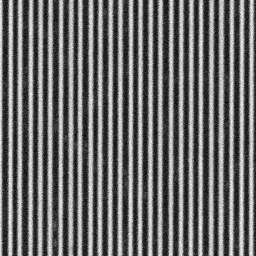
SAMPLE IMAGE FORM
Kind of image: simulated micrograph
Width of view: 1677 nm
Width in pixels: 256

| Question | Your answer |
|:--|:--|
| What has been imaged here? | parallel lines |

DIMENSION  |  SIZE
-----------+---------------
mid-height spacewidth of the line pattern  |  41 nm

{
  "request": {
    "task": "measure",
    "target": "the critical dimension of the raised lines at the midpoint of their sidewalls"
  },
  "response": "22.9 nm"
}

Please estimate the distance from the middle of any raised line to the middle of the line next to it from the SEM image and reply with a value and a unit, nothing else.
65.7 nanometres